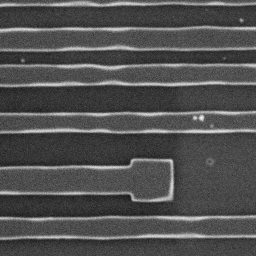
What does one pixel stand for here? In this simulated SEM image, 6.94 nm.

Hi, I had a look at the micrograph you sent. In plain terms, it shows groups of lines, slits or small figures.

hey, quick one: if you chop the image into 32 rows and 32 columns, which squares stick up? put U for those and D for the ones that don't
UUUUUUUUUDDUUUUDDUUUDDDDUUDDUUUU
DDDDDDDDDDDDDDDDDDDDDDDDDDDDDDDD
DDDDDDDDDDDDDDDDDDDDDDDDDDDDDDDD
DDDDDDDDDDDDDDDDUUDDDDUUUUUUUUUD
UUUUUUUUUUUUUUUUUUUUUUUUUUUUUUUU
UUUUUUUUUUUUUUUUUUUUUUUUUUUUUUUU
DDDDDDDDDDDDDDDDDDDDDDDDDDDDDDDD
DDDDDDDDDDDDDDDDDDDDDDDDDDDDDDDD
UUUUUUUUUUUUUUUUUUUUUUUUUUUUUUUU
UUUUUUUUUUUUUUUUUUUUUUUUUUUUUUUU
UUUUUUUUUUUUUDDUUUUUUUUUUDDDUUUU
DDDDDDDDDDDDDDDDDDDDDDDDDDDDDDDD
DDDDDDDDDDDDDDDDDDDDDDDDDDDDDDDD
DDDDDDDDDDDDDDDDDDDDDDDDDDDDDDDD
UUUUUUUUUUUUUUUUUUUUUUUUUUUUUUUU
UUUUUUUUUUUUUUUUUUUUUUUUUUUUUUUU
UUUDDDDDDDDDDUUUUUDDDUUDDDDDDDDD
DDDDDDDDDDDDDDDDDDDDDDDDDDDDDDDD
DDDDDDDDDDDDDDDDDDDDDDDDDDDDDDDD
DDDDDDDDDDDDDDDDDDDDDDDDDDDDDDDD
DDDDDDDDDDDDDDDDUUUUUUDDDDDDDDDD
UUUUUUUUUUUUUUUUUUUUUUDDDDDDDDDD
UUUUUUUUUUUUUUUUUUUUUUDDDDDDDDDD
UUUUUUUUUUUUUUUUUUUUUDDDDDDDDDDD
DDDDDDDDDDDDDDDDUUUUUDDDDDDDDDDD
DDDDDDDDDDDDDDDDDDDDDDDDDDDDDDDD
DDDDDDDDDDDDDDDDDDDDDDDDDDDDDDDD
UUUUUUUUUUUUUUUUUUUUUUUUUUUUUUUU
UUUUUUUUUUUUUUUUUUUUUUUUUUUUUUUU
UUUUUUUUUUUUUUUUUUUDDDDDDUUUUUUU
DDDDDDDDDDDDDDDDDDDDDDDDDDDDDDDD
DDDDDDDDDDDDDDDDDDDDDDDDDDDDDDDD